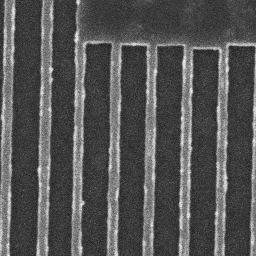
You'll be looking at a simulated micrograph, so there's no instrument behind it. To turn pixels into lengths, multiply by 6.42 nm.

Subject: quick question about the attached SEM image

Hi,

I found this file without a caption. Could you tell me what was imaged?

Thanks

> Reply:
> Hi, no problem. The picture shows parallel lines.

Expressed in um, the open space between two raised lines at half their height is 0.17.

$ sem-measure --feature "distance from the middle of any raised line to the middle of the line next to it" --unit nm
232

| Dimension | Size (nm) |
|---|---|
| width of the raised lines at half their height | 64.2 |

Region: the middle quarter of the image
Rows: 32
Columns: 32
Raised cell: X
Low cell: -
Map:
---XX-------XX-------XX-------XX
---XX-------XX-------XX-------XX
---XX-------XX-------XX-------XX
---XX-------XX-------XX-------XX
---XX-------XX-------XX-------XX
---XX-------XX-------XX-------XX
---XX-------XX-------XX-------XX
---XX-------XX-------XX-------XX
---XX-------XX-------XX-------XX
---XX-------XX-------XX------XXX
---XX-------XX-------XX------XXX
---XX-------XX-------XX------XXX
---XX-------XX-------XX------XXX
---XX-------XX------XXX------XXX
---XX-------XX------XXX------XXX
---XX-------XX------XXX------XXX
---XX-------XX-------XX------XXX
--XXX-------XX------XXX------XXX
--XXX-------XX-------XX------XXX
---XX-------XX-------XX------XXX
---XX-------XX------XXX------XXX
--XXX------XXX------XXX------XXX
---XX------XXX------XXX------XXX
---X-------XXX------XXX------XX-
--XX-------XXX------XXX------XX-
--XX-------XXX------XXX------XXX
---X-------XXX------XX-------XXX
---X-------XXX------XXX------XXX
--XXX------XXX------XXX------XXX
--XX-------XXX------XXX------XXX
---X-------XXX------XXX------XXX
--XX-------XXX------XX-------XXX